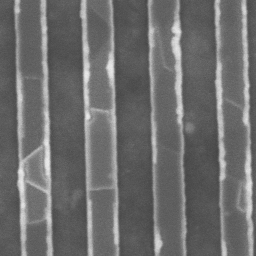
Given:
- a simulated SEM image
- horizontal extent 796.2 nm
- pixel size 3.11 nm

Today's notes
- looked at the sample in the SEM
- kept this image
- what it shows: one or a few lines or trenches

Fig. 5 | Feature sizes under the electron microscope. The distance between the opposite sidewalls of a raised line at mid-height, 0.0936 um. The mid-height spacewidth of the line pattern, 36.8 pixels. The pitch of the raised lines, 208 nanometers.